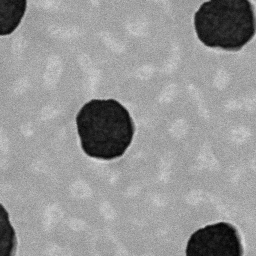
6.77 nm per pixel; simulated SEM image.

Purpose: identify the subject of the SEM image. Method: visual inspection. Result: holes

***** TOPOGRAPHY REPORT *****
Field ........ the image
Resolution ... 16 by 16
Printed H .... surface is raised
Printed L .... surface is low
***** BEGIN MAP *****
LLHHHHHHHHHHLLLL
LHHHHHHHHHHHLLLL
HHHHHHHHHHHHHLLL
HHHHHHHHHHHHHHHH
HHHHHHHHHHHHHHHH
HHHHHHHHHHHHHHHH
HHHHHLLLHHHHHHHH
HHHHHLLLHHHHHHHH
HHHHHLLLHHHHHHHH
HHHHHLLLHHHHHHHH
HHHHHHHHHHHHHHHH
HHHHHHHHHHHHHHHH
HHHHHHHHHHHHHHHH
LHHHHHHHHHHHHHHH
LHHHHHHHHHHHLLLH
LHHHHHHHHHHHLLLH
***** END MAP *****